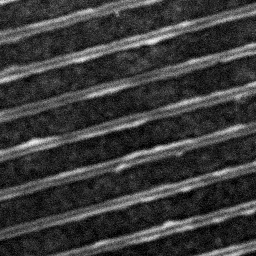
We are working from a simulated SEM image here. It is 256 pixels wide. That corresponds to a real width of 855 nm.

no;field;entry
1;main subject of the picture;parallel lines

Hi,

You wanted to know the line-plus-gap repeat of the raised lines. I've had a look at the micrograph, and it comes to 0.127 micrometres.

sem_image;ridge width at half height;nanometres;29.5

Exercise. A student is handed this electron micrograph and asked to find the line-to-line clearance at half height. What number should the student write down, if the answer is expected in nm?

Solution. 97.7